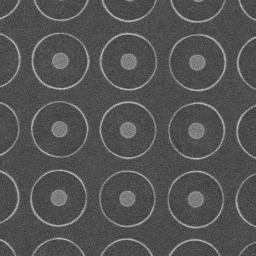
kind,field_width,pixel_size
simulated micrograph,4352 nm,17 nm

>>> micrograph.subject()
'an array of small figures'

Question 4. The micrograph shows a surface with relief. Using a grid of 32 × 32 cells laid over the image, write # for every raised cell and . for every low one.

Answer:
..###......##......###......##..
.####.....####.....###.....####.
#######.#######..######...######
################################
.#####...######..#######..######
..###.....###......###.....####.
..##.......##......##.......##..
..##.......##......##.......##..
..##.......##......##.......##..
..###.....###......###......##..
.#####...#####....#####....####.
################################
################################
.####.....####....#####....####.
..##......###......###.....###..
..##.......##......##.......##..
..##.......##......##.......##..
..##.......##......##.......##..
.####.....###......###.....###..
#######.#######..######...######
################################
######...######.########.#######
..###.....###.....####.....####.
..##.......##......##.......##..
..##.......##......##.......##..
..##.......##......##.......##..
..##......###......##......###..
.####....#####....####.....####.
################################
################################
.####....#####....#####...######
..##......###......###.....###..